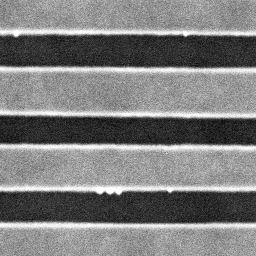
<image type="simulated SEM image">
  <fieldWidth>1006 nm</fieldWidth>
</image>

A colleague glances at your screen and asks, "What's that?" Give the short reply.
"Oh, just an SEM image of lines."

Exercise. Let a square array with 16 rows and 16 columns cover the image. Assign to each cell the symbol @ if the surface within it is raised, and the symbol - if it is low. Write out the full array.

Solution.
@@@@@@@@@@@@@@@@
@@@@@@@@@@@@@@@@
----------------
----------------
@@@@@@@@@@@@@@@@
@@@@@@@@@@@@@@@@
@@@@@@@@@@@@@@@@
----------------
----------------
@@@@@@@@@@@@@@@@
@@@@@@@@@@@@@@@@
@@@@@@@@@@@@@@@@
----------------
----------------
@@@@@@@@@@@@@@@@
@@@@@@@@@@@@@@@@